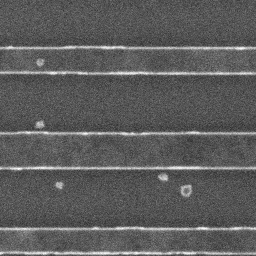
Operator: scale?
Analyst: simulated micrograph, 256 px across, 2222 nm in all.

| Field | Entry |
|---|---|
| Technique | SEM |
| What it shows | lines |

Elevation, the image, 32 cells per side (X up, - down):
--------------------------------
--------------------------------
--------------------------------
--------------------------------
--------------------------------
--------------------------------
XXXXXXXXXXXXXXXXXXXXXXXXXXXXXXXX
XXXXXXXXXXXXXXXXXXXXXXXXXXXXXXXX
XXXXXXXXXXXXXXXXXXXXXXXXXXXXXXXX
--------------------------------
--------------------------------
--------------------------------
--------------------------------
--------------------------------
--------------------------------
--------------------------------
--------------------------------
XXXXXXXXXXXXXXXXXXXXXXXXXXXXXXXX
XXXXXXXXXXXXXXXXXXXXXXXXXXXXXXXX
XXXXXXXXXXXXXXXXXXXXXXXXXXXXXXXX
XXXXXXXXXXXXXXXXXXXXXXXXXXXXXXXX
--------------------------------
--------------------------------
--------------------------------
--------------------------------
--------------------------------
--------------------------------
--------------------------------
--------------------------------
XXXXXXXXXXXXXXXXXXXXXXXXXXXXXXXX
XXXXXXXXXXXXXXXXXXXXXXXXXXXXXXXX
XXXXXXXXXXXXXXXXXXXXXXXXXXXXXXXX